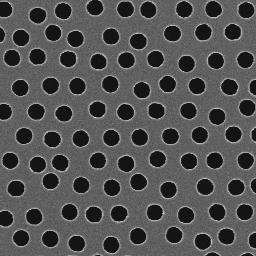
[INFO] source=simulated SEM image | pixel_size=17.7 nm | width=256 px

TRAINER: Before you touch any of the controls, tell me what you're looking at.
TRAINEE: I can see a regular array of holes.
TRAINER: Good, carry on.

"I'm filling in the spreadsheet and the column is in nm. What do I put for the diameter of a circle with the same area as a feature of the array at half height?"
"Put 289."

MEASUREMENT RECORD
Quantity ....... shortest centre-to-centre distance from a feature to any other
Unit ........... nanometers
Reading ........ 455